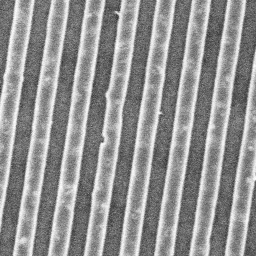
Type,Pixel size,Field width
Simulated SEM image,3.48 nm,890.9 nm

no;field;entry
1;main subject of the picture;parallel lines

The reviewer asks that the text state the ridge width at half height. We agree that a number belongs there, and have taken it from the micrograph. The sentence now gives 61.5 nm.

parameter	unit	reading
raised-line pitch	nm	121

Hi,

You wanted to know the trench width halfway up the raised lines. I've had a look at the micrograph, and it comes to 61.1 nm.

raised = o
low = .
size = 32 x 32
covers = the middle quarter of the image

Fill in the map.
...ooooo....ooooo....oooo.....oo
...oooo.....oooo.....oooo.....oo
...oooo.....oooo.....oooo.....oo
...oooo.....oooo....ooooo....ooo
...oooo.....oooo....ooooo....ooo
...oooo....ooooo....ooooo....ooo
..ooooo....ooooo....oooo.....ooo
..ooooo....oooo.....oooo.....ooo
..oooo.....oooo.....oooo.....ooo
..oooo.....oooo.....oooo....oooo
..oooo.....oooo....ooooo....oooo
..oooo.....ooo.....ooooo....oooo
.ooooo....oooo.....ooooo....oooo
.ooooo....oooo.....ooooo....oooo
.ooooo....oooo.....oooo.....oooo
.oooo.....oooo.....oooo.....oooo
.oooo.....oooo.....oooo....ooooo
.oooo.....oooo....ooooo....ooooo
.oooo.....oooo....ooooo....oooo.
ooooo.....oooo....oooo.....oooo.
ooooo....ooooo....oooo.....oooo.
oooo.....oooo.....oooo.....oooo.
oooo.....oooo.....oooo.....oooo.
oooo.....oooo....ooooo....ooooo.
oooo.....oooo....ooooo....ooooo.
oooo....ooooo....ooooo....oooo..
oooo....ooooo....ooooo....oooo..
oooo....ooooo....oooo.....oooo..
oooo....oooo.....oooo....ooooo..
oooo....oooo.....oooo....ooooo..
ooo.....oooo....ooooo....ooooo..
ooo....ooooo....ooooo....oooo...